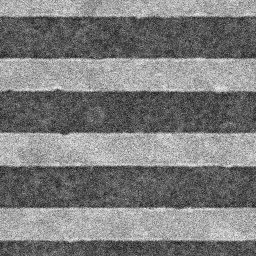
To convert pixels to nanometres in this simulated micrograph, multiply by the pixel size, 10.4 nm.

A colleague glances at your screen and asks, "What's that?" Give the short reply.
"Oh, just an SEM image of one or a few lines or trenches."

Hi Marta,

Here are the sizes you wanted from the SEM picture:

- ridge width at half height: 0.328 um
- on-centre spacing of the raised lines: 74.6 pixels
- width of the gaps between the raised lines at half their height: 450 nm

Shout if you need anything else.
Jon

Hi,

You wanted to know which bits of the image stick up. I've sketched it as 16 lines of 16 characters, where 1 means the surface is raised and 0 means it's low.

1111111111111111
0000000000000000
0000000000000000
0000000000000000
1111111111111111
1111111111111111
0000000000000000
0000000000000000
1111111111111111
1111111111111111
0000100000000000
0000000000000000
0000000000000000
1111111111111111
1111111111111111
0000000000000000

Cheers